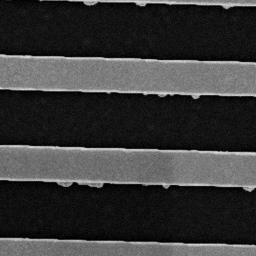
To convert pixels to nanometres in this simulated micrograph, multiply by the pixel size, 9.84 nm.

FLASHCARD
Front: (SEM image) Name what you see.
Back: lines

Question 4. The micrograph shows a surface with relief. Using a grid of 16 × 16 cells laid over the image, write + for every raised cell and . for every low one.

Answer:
................
................
................
++..............
++++++++++++++++
++++++++++++++++
................
................
................
++++++++++++++..
++++++++++++++++
.........+++++++
................
................
................
++++++++++++++++